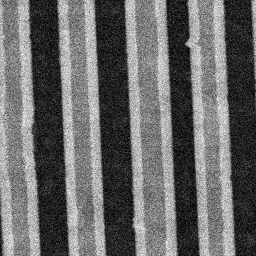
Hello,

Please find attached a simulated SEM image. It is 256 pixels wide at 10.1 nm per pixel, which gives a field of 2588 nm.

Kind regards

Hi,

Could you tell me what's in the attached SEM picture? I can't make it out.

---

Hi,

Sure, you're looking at one or a few lines or trenches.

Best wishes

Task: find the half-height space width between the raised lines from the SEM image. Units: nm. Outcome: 405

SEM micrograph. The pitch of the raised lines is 657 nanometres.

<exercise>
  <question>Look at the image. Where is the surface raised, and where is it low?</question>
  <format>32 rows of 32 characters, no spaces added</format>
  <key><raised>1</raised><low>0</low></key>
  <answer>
11100000111000001111000011100000
11100000111000001111000011100000
11100000111000001111000011100000
11100000111000001111000011100000
11100000111000001111000011100000
11100000111000000111000011100000
11100000111000000111000011100000
11100000111000000111000001100000
11100000111000000111000001110000
11100000111000000111000001110000
11100000111100000111000001110000
11100000111100000111000001110000
11100000111100000111000001110000
11110000011100000111100001110000
11100000011100000111100001110000
11100000011100000111100001110000
11100000011100000111100001110000
11100000011100000111100001110000
11100000011100000111100001110000
11100000011100000111100001110000
11110000011100000111100001110000
11110000011100000111100001110000
01110000011100000111100001110000
01110000011100000111100001110000
01110000011100000111100001110000
01110000011100000011100001110000
01110000011100000011100001110000
01110000011100000011100001110000
01110000011100000011100001110000
01110000011100000011100000110000
01110000011100000011100000111000
01110000011100000011100000111000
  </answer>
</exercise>